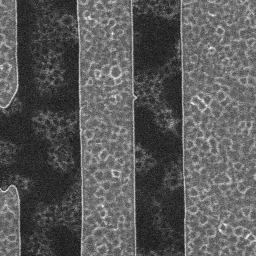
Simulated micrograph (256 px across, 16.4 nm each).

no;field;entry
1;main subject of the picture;one or a few lines or trenches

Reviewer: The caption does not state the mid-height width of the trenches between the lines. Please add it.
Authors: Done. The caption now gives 52.5 px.